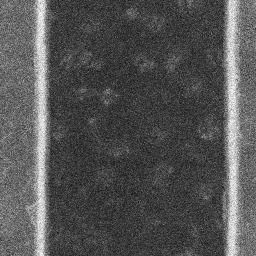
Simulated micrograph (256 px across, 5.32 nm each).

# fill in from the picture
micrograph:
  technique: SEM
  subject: one or a few lines or trenches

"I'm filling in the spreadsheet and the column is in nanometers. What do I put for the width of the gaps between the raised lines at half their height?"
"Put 1010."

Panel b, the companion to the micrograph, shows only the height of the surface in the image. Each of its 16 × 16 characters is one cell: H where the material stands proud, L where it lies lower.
HHHLLLLLLLLLLLHH
HHHLLLLLLLLLLLHH
HHHLLLLLLLLLLLHH
HHHLLLLLLLLLLLHH
HHHLLLLLLLLLLLHH
HHHLLLLLLLLLLLLH
HHHLLLLLLLLLLLLH
HHHLLLLLLLLLLLLH
HHHLLLLLLLLLLLLH
HHHLLLLLLLLLLLLH
HHHLLLLLLLLLLLLH
HHHLLLLLLLLLLLLH
HHHLLLLLLLLLLLLH
HHHLLLLLLLLLLLLH
HHHLLLLLLLLLLLHH
HHHLLLLLLLLLLLHH